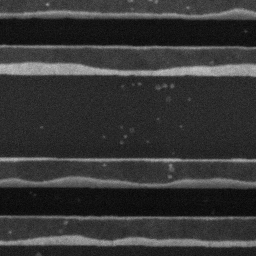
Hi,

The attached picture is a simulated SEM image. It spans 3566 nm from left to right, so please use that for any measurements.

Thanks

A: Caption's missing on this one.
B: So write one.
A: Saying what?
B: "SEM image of lines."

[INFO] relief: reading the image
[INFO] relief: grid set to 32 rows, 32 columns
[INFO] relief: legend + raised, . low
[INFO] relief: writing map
++++++++++++++++++++++++++++++++
++++++++++++++++++++++++++++++++
................................
................................
................................
................................
++++++++++++++++++++++++++++++++
++++++++++++++++++++++++++++++++
++++++++++++++++++++++++++++++++
................................
................................
................................
................................
................................
................................
................................
................................
................................
................................
................................
++++++++++++++++++++++++++++++++
++++++++++++++++++++++++++++++++
++++++++++++++++++++++++++++++++
................................
................................
................................
................................
++++++++++++++++++++++++++++++++
++++++++++++++++++++++++++++++++
++++++++++++++++++++++++++++++++
..........................+.....
................................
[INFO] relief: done